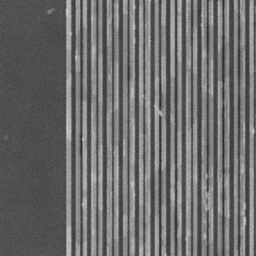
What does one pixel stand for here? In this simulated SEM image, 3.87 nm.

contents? parallel lines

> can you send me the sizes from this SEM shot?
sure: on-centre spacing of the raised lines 7.96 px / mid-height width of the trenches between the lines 4.88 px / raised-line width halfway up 4.01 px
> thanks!